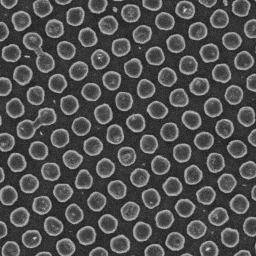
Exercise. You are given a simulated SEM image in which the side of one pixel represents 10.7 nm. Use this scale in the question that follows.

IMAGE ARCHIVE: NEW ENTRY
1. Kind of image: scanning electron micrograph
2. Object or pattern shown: a regular array of raised bodies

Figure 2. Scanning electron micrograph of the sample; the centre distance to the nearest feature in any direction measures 256 nm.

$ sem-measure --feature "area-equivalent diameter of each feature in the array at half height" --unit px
17.9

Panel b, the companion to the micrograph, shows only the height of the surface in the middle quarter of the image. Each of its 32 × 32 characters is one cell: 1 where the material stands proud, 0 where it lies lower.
00111101110000011110000000000111
01111100000000011110000001100111
01111100001110001110000011110000
00111000001111000000000011110000
00000000001111000001100011110000
00000111100111000001110000000000
00000111100000000011111000001100
00000111100000110001110000011100
11100111100001111000000000011110
11100000000001111000001100011110
11100000011001111000011110000100
11100000111100110000011111000000
11000000111100000000011110000011
00001000111100001111000100000011
00111100011000001111000000000011
00111110000011001111000001110001
00111100000111000111000011110000
10011000000111100000000011110000
10000001000111100000111001110000
10000111100011000001111000000000
00000111110000000001111000001110
00000111100000111000111000001111
11110011000000111100000000011111
11110000000000111100000110001110
11110000011100111000001111000000
01100000111110000000001111000000
00000000111100000011001111000011
00001100011100000111100100000011
00011110000000000111100000010011
00011110000011000111100000111001
10011110000111100011000001111000
11000000000111100000011001111000